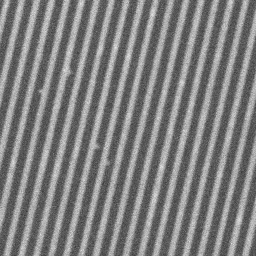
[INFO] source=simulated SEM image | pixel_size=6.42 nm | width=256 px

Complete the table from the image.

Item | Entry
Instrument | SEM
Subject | parallel lines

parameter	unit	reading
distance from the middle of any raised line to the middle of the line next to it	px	14.5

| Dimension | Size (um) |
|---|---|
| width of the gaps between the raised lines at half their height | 0.061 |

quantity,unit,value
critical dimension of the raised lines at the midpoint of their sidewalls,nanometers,35.9